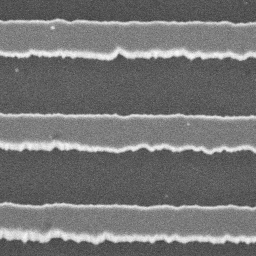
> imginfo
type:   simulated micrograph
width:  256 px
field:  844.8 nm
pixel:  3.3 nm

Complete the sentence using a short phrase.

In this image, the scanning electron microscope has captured lines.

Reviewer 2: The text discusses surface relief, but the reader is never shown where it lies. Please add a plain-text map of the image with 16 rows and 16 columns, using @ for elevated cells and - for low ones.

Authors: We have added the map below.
----------------
@@@@@@@@@@@@@@@@
@@@@@@@@@@@@@@@@
-@-@@@@-@@@@@@@@
----------------
----------------
----------------
@@@@@@@@@@@@@@@@
@@@@@@@@@@@@@@@@
----------------
----------------
----------------
----------------
@@@@@@@@@@@@@@@@
@@@@@@@@@@@@@@@@
----------------